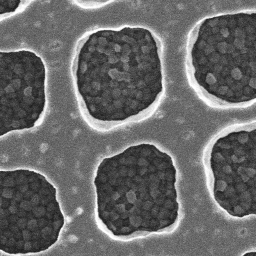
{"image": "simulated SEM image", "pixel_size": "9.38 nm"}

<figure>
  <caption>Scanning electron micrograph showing holes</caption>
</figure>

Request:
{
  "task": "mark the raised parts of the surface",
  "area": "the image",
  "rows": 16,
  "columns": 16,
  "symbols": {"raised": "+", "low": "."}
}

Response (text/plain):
.+++++++++++++++
++++++++++++....
+++++.....++....
..+++.....++....
...++.....++....
...++.....++....
...++.....++++.+
..++++..++++++++
++++++++++++++..
++++++++..+++...
++++++.....++...
...+++.....++...
....++.....+++..
....++.....+++++
....+++...++++++
...+++++++++++++